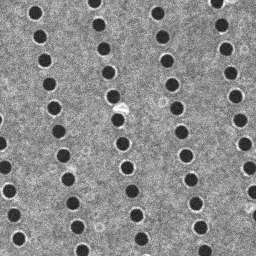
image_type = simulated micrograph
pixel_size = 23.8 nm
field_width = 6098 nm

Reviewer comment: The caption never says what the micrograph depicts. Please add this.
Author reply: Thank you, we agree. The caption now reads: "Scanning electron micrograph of a regular array of holes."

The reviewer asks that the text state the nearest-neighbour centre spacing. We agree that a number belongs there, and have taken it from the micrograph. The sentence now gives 575 nm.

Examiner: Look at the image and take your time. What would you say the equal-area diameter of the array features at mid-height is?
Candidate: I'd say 14.3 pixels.